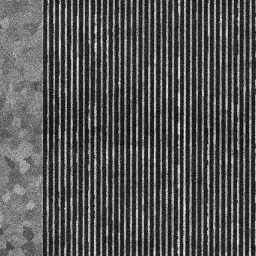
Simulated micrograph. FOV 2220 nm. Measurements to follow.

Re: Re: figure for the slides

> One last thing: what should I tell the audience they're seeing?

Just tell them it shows parallel lines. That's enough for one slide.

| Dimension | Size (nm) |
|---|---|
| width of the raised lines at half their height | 13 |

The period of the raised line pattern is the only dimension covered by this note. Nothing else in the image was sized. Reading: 0.0516 µm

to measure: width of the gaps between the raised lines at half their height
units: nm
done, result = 39